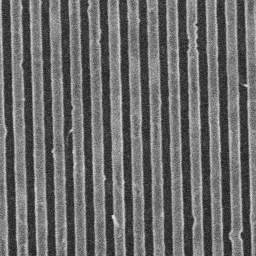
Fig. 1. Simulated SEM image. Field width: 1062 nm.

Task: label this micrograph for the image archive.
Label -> parallel lines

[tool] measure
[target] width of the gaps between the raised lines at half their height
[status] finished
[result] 36.8 nanometers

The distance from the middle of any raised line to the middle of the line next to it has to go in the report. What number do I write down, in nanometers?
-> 81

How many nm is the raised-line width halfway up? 44.1